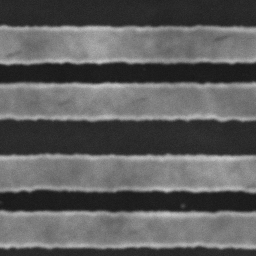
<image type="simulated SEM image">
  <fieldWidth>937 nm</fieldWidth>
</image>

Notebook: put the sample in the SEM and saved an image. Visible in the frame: lines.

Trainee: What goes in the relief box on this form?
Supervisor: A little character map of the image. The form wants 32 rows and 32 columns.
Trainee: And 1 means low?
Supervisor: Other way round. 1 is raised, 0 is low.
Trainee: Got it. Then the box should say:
00000000000000000000000000000000
00000000000000000000000000000000
00000000000000000000000000000000
11111111111111111111111111111111
11111111111111111111111111111111
11111111111111111111111111111111
11111111111111111111111111111111
11111111111111111111111111111111
00000000000000000000000000000000
00000000000000000000000000000000
11111111111111111111111111111111
11111111111111111111111111111111
11111111111111111111111111111111
11111111111111111111111111111111
11111111111111111111111111111111
00000000000000000000000000000000
00000000000000000000000000000000
00000000000000000000000000000000
00000000000000000000000000000000
11111111111111111111111111111111
11111111111111111111111111111111
11111111111111111111111111111111
11111111111111111111111111111111
11111111111111111111111111111111
00000000000000000000000000000000
00000000000000000000000000000000
10101111111111010111010010011100
11111111111111111111111111111111
11111111111111111111111111111111
11111111111111111111111111111111
11111111111111111111111111111111
00000000000000000000000000000000